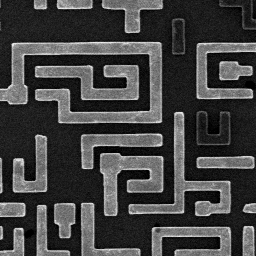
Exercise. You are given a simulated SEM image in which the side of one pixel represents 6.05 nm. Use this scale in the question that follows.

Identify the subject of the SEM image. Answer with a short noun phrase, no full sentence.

wiring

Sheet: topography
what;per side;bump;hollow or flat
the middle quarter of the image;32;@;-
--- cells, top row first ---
-----@@---@@@@@@@@---@@@--------
@@@@@@@---@@@@@@@@----@@--------
@@@@@@@---@@@@@@@@----@@--------
----@@@---------@@----@@--------
----@@@---------@@----@@--------
----@@@---------@@----@@--------
@---@@@@@@@@@@@@@@----@@--------
@---@@@@@@@@@@@@@@----@@--------
@---@@@@@@@@@@@@@@----@@--------
@---------------------@@--------
@---------------------@@--------
@@-------------------@@@--------
@@@@@@@@@@@@@@@@@@@@@@@@----@@--
@@@@@@@@@@@@@@@@@@@@@@@@----@@--
@@@@@@@@@-------@@@@@@@@----@@--
----------------------------@@--
----------------------------@@--
----------------------------@@--
----@@@@@@@@@@@@@@@@@@@@----@@--
----@@@@@@@@@@@@@@@@@@@@----@@--
----@@@@@----@@@@@@@@@@@----@@--
----@@@---------------------@@--
-----@@---------------------@@--
-----@@--@@@@@@@@@@@@@@@@---@@--
-----@@--@@@@@@@@@@@@@@@@---@@--
-----@@--@@@@@@@@@@@@@@@@---@@--
---------@@@@@@------@@@@---@@--
----------@@@--------@@@@---@@--
----------@@@--------@@@@---@@--
----------@@@---@@@@@@@@@---@@@@
----------@@@---@@@@@@@@@---@@@@
----------@@@---@@@@@@@@@---@@@@